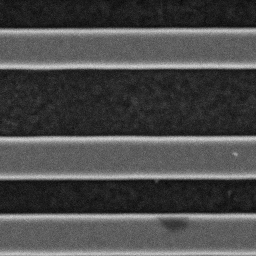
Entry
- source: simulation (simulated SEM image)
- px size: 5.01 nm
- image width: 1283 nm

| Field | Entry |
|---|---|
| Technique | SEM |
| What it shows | groups of lines, slits or small figures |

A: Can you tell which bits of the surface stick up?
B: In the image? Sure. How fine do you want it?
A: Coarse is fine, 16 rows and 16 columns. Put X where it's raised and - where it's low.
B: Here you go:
----------------
----------------
XXXXXXXXXXXXXXXX
XXXXXXXXXXXXXXXX
----------------
----------------
----------------
----------------
----------------
XXXXXXXXXXXXXXXX
XXXXXXXXXXXXXXXX
----------------
----------------
XXXXXXXXXXXXXXXX
XXXXXXXXXXXXXXXX
XXXXXXXXXXXXXXXX